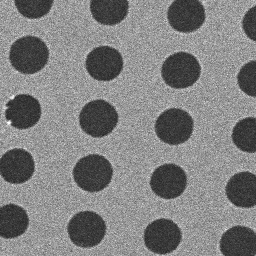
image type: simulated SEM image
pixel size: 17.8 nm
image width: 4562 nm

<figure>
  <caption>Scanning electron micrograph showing a regular array of holes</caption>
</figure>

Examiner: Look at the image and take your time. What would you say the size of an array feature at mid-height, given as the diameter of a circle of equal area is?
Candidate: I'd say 691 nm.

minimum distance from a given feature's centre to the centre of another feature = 987 nanometers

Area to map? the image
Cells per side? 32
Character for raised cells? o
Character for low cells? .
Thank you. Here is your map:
oo.....oooo.....ooooo....ooooooo
oo....ooooo.....ooooo.....ooooo.
oooooooooooo...oooooo.....oooo..
oooooooooooooooooooooo...ooooo..
ooo.ooooooooooooooooooooooooooo.
oo....oooooooooooooooooooooooooo
o.....ooooo....ooooooo.ooooooooo
o.....ooooo....oooooo....ooooooo
oo...oooooo....ooooo.....ooooo..
ooooooooooo....ooooo.....ooooo..
ooooooooooooooooooooo...oooooo..
oooooooooooooooooooooooooooooo..
o....ooooooo.ooooooooooooooooooo
o....ooooo....ooooooo.oooooooooo
o....ooooo.....ooooo....oooooooo
o....ooooo.....oooo.....ooooo...
ooooooooooo...ooooo.....ooooo...
oooooooooooooooooooo...oooooo...
oooooooooooooooooooooooooooooo..
....ooooooo..ooooooooooooooooooo
....ooooo.....oooooo..oooooooooo
....ooooo.....ooooo....ooooooo.o
o...ooooo.....ooooo....oooooo...
oooooooooo...oooooo....ooooo....
oooooooooooooooooooo..oooooo....
o.ooooooooooooooooooooooooooo...
...ooooooo..oooooooooooooooooooo
....ooooo....oooooo..ooooooooooo
...ooooo.....ooooo....ooooooo..o
..ooooooo....ooooo.....ooooo....
ooooooooo...oooooo....ooooo.....
ooooooooooooooooooo...oooooo....